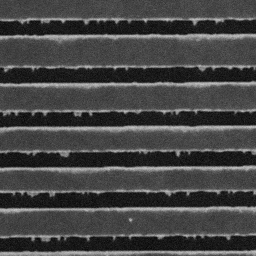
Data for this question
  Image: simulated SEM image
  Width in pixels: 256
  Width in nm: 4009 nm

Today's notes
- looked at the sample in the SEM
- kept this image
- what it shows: lines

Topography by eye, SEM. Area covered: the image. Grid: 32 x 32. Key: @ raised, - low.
@@@@@@@@@@@@@@@@@@@@@@@@@@@@@@@@
@@@@@@@@@@@@@@@@@@@@@@@@@@@@@@@@
@@@@----------------------------
--------------------------------
-----@@--@@@@@@@@@@@@@@@@@@@@@@@
@@@@@@@@@@@@@@@@@@@@@@@@@@@@@@@@
@@@@@@@@@@@@@@@@@@@@@@@@@@@@@@@@
@@@@@@@@@@@@@@@@@@@@@@@@@@@@@@@@
--------------------------------
--------------------------------
----@@@@-@@@@@@@@@@@@@@@@@@@@@@@
@@@@@@@@@@@@@@@@@@@@@@@@@@@@@@@@
@@@@@@@@@@@@@@@@@@@@@@@@@@@@@@@@
@@@@@@@@@@@@@@@@@@@@@@@@@@@@@@@@
--------------------------------
--------------------------------
@@@@@@@@@@@@@@@@@@@@@@@@@@@@@@@@
@@@@@@@@@@@@@@@@@@@@@@@@@@@@@@@@
@@@@@@@@@@@@@@@@@@@@@@@@@@@@@@@@
--------------------------------
--------------------------------
@@@@@@@@@@@@@@@@@@@@@@@@@@@@@@@@
@@@@@@@@@@@@@@@@@@@@@@@@@@@@@@@@
@@@@@@@@@@@@@@@@@@@@@@@@@@@@@@@@
--------------------------------
--------------------------------
@@@@@@@@@@@@@@@@@@@@@@@@@@@@@@@@
@@@@@@@@@@@@@@@@@@@@@@@@@@@@@@@@
@@@@@@@@@@@@@@@@@@@@@@@@@@@@@@@@
@@@@@@@@@@@@--------------------
--------------------------------
--------@@@----@@@@@@@@@@@@@@@@@